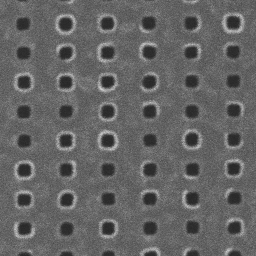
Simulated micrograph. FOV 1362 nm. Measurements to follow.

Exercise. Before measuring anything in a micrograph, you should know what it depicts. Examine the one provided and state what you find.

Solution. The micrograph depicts a regular array of holes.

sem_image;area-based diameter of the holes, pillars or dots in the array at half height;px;14.5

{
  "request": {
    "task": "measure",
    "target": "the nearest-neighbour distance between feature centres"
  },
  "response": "29.1 pixels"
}